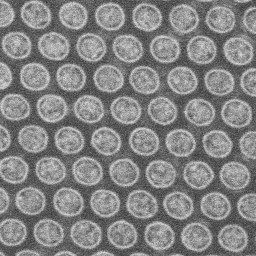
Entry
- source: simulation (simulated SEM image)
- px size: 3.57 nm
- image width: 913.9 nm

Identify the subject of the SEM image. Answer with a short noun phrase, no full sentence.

a regular array of raised bodies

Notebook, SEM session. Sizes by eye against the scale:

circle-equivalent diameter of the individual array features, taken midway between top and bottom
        26.8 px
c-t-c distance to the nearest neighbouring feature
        128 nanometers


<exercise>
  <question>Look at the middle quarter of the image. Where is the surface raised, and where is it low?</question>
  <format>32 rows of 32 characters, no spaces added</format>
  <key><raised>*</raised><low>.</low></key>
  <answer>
***.......*.....................
****.....****.....****.....****.
*****...******...******...******
*****...*******..*******..******
*****...*******..*******..******
****.....*****...******....*****
.*........***.....*****....*****
................................
.....***......**................
...******....*****....****......
...******...*******..******....*
...*******..*******..*******..**
...*******..*******..*******..**
....*****....*****....******...*
...............**.......**......
................................
***......**.......***...........
****....*****....*****....*****.
****...*******...******...******
*****..*******...******...******
*****...******...******...******
****....*****.....*****....*****
..........**................***.
................................
...*****.....****......*........
...******...******...******....*
...******...******...******...**
...******...*******..******...**
...******...******...******...**
....****.....*****....*****....*
.......................***......
**..............................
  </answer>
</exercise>